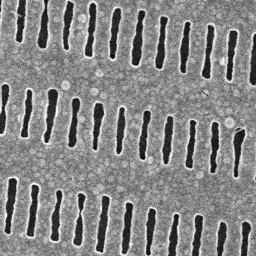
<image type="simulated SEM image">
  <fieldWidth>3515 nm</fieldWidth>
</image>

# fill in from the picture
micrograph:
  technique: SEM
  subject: a regular array of holes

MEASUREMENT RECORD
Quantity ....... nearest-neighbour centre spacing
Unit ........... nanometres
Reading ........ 323